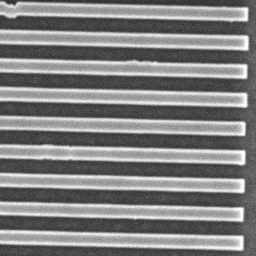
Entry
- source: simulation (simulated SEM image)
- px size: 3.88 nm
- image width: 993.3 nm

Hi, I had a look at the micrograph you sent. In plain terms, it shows parallel lines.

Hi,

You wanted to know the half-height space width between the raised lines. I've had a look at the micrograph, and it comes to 62.5 nm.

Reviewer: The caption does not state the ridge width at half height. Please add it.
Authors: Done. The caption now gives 47.9 nanometres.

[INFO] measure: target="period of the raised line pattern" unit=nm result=111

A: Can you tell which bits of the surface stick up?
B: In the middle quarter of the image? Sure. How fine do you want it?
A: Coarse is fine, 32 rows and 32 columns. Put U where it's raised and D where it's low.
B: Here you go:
UUUUUUUUUUUUUUUUUUUUUUUUUUUUUUUU
UUUUUUUUUUUUUUUUUUUUUUUUUUUUUUUU
DDDDDDDDDUUDDDUUUUUUUUUUUUUUUUUU
DDDDDDDDDDDDDDDDDDDDDDDDDDDDDDDD
DDDDDDDDDDDDDDDDDDDDDDDDDDDDDDDD
DDDDDDDDDDDDDDDDDDDDDDDDDDDDDDDD
UUUUDDDDDDDDDDDDDDDDDDDDDDDDDDDD
UUUUUUUUUUUUUUUUUUUUUUUUUUUUUUUU
UUUUUUUUUUUUUUUUUUUUUUUUUUUUUUUU
DDDDDDDDDDUUUUUUUUUUUUUUUUUUUUUU
DDDDDDDDDDDDDDDDDDDDDDDDDDDDDDDD
DDDDDDDDDDDDDDDDDDDDDDDDDDDDDDDD
DDDDDDDDDDDDDDDDDDDDDDDDDDDDDDDD
DDDDDDDDDDDDDDDDDDDDDDDDDDDDDDDD
UUUUUUUUUUUUUUUUUUUUUUUUUUUUUUDD
UUUUUUUUUUUUUUUUUUUUUUUUUUUUUUUU
UUUUUUUUUUUUUUUUUUUUUUUUUUUUUUUU
DDDDDDDDDDDDDDDDDDDDDDDDDDDDDDDD
DDDDDDDDDDDDDDDDDDDDDDDDDDDDDDDD
DDDDDDDDDDDDDDDDDDDDDDDDDDDDDDDD
DDDDDDDDDDDDDDDDDDDDDDDDDDDDDDDD
UUUUUUUUUUUUUUUUUUUUUUUUUDDDDDDD
UUUUUUUUUUUUUUUUUUUUUUUUUUUUUUUU
UUUUUUUUUUUUUUUUUUUUUUUUUUUUUUUU
DDDDDDDDDDDDDDDDDDDDDDDDDDDDDDDU
DDDDDDDDDDDDDDDDDDDDDDDDDDDDDDDD
DDDDDDDDDDDDDDDDDDDDDDDDDDDDDDDD
DDDDDDDDDDDDDDDDDDDDDDDDDDDDDDDD
UUUUUUUUUUUUUUUUUUUUUDDDDDDDDDDD
UUUUUUUUUUUUUUUUUUUUUUUUUUUUUUUU
UUUUUUUUUUUUUUUUUUUUUUUUUUUUUUUU
DDDDDDDDDDDDDDDDDDDDDDDDDDUUUUUU